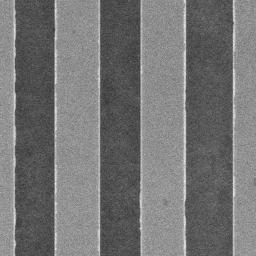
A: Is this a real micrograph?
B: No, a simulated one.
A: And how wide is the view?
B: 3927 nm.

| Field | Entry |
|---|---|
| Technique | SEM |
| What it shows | lines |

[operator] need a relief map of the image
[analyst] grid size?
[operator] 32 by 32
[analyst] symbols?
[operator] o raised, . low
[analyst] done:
oo.....ooooo......ooooo......ooo
oo.....ooooo......ooooo......ooo
oo.....ooooo......ooooo......ooo
oo.....ooooo......ooooo......ooo
oo.....ooooo......ooooo......ooo
oo.....ooooo......ooooo......ooo
oo.....ooooo......ooooo......ooo
oo.....ooooo......ooooo......ooo
oo.....ooooo......ooooo......ooo
oo.....ooooo......ooooo......ooo
oo.....ooooo......ooooo......ooo
oo.....ooooo......ooooo......ooo
oo.....ooooo......ooooo......ooo
oo.....ooooo......ooooo......ooo
oo.....ooooo......ooooo......ooo
oo.....ooooo......ooooo......ooo
oo.....ooooo......ooooo......ooo
oo.....ooooo......ooooo......ooo
oo.....ooooo......ooooo......ooo
oo.....ooooo......ooooo......ooo
oo.....ooooo......ooooo......ooo
oo.....ooooo......ooooo......ooo
oo.....ooooo......ooooo......ooo
oo.....ooooo......ooooo......ooo
oo.....ooooo......ooooo......ooo
oo.....ooooo......ooooo......ooo
oo.....ooooo......ooooo......ooo
oo.....ooooo......ooooo......ooo
oo.....ooooo......ooooo......ooo
oo.....ooooo......ooooo......ooo
oo.....ooooo......ooooo......ooo
oo.....ooooo......ooooo......ooo